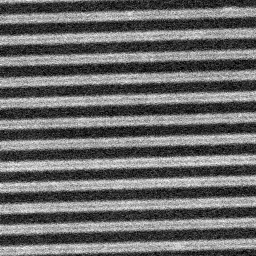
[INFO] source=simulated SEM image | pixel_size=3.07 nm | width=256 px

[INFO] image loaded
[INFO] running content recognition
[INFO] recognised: parallel lines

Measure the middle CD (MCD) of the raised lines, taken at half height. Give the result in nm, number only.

23.4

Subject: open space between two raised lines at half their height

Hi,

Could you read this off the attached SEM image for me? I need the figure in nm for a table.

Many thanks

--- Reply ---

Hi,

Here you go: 41.1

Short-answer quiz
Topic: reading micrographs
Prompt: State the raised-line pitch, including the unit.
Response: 0.0647 µm